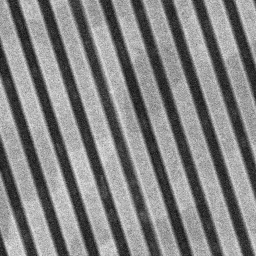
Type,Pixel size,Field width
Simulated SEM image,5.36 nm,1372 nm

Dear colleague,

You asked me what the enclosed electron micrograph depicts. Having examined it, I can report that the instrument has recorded parallel lines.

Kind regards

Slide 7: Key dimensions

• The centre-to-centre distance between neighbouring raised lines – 158 nm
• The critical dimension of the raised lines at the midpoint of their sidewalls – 89.9 nm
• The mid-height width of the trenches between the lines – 65.1 nm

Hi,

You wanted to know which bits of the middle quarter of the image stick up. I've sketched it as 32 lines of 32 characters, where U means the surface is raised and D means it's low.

DDUUUUDDDDUUUUDDDUUUUUDDDUUUUDDD
DDUUUUUDDDUUUUDDDDUUUUDDDUUUUUDD
DDUUUUUDDDUUUUUDDDUUUUDDDDUUUUDD
DDDUUUUDDDDUUUUDDDUUUUUDDDUUUUDD
DDDUUUUDDDDUUUUDDDUUUUUDDDUUUUUD
DDDUUUUUDDDUUUUUDDDUUUUDDDDUUUUD
DDDDUUUUDDDDUUUUDDDUUUUDDDDUUUUD
UDDDUUUUDDDDUUUUDDDUUUUUDDDUUUUU
UDDDUUUUUDDDUUUUUDDDUUUUDDDDUUUU
UDDDDUUUUDDDUUUUUDDDUUUUDDDDUUUU
UUDDDUUUUDDDDUUUUDDDUUUUUDDDUUUU
UUDDDUUUUUDDDUUUUUDDDUUUUDDDDUUU
UUDDDDUUUUDDDUUUUUDDDUUUUDDDDUUU
UUUDDDUUUUDDDDUUUUDDDUUUUUDDDUUU
UUUDDDUUUUUDDDUUUUDDDDUUUUDDDUUU
UUUDDDDUUUUDDDUUUUUDDDUUUUDDDDUU
UUUDDDDUUUUDDDDUUUUDDDUUUUUDDDUU
UUUUDDDUUUUUDDDUUUUDDDDUUUUDDDUU
UUUUDDDDUUUUDDDUUUUUDDDUUUUDDDDU
UUUUUDDDUUUUDDDDUUUUDDDUUUUUDDDU
UUUUUDDDUUUUUDDDUUUUDDDDUUUUDDDU
DUUUUDDDDUUUUDDDUUUUUDDDUUUUDDDD
DUUUUDDDDUUUUDDDDUUUUDDDUUUUUDDD
DUUUUUDDDUUUUUDDDUUUUDDDDUUUUDDD
DDUUUUDDDUUUUUDDDUUUUUDDDUUUUDDD
DDUUUUDDDDUUUUDDDDUUUUDDDUUUUUDD
DDUUUUUDDDUUUUDDDDUUUUDDDUUUUUDD
DDDUUUUDDDUUUUUDDDUUUUUDDDUUUUDD
DDDUUUUDDDDUUUUDDDDUUUUDDDUUUUUD
DDDUUUUUDDDUUUUDDDDUUUUDDDUUUUUD
DDDDUUUUDDDUUUUUDDDUUUUUDDDUUUUD
UDDDUUUUDDDDUUUUDDDDUUUUDDDUUUUD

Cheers